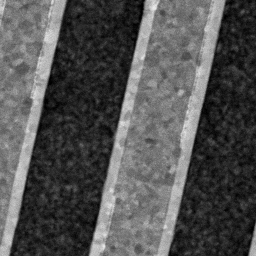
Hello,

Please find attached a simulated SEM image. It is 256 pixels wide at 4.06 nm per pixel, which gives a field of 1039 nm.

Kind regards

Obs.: one or a few lines or trenches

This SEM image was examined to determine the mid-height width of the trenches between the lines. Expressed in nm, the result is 368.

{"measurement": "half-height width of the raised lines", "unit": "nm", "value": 265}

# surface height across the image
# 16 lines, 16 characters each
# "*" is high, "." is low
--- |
****.....*****..
***......****...
***......****...
***......****...
***......****...
***.....****....
**......****....
**......****....
**......****....
**.....*****....
*......****.....
*......****.....
*......****.....
*......****.....
*.....****......
......****......